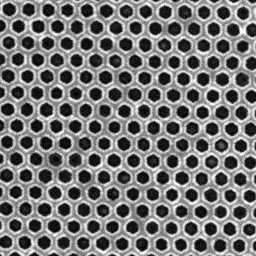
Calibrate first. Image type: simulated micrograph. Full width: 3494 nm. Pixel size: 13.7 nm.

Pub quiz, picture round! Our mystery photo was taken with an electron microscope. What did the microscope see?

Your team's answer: a regular array of holes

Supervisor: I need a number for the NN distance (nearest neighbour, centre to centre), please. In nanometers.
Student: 259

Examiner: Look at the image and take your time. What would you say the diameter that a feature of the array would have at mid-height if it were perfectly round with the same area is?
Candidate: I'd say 187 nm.